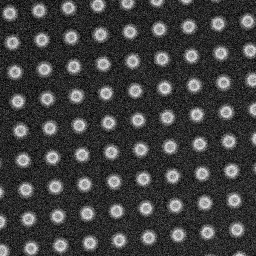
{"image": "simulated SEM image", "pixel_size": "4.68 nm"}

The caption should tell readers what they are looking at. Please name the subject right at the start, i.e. an array of small figures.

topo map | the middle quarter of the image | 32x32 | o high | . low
oooo....oooo...oooo.....o.......
.ooo.....oo.....................
.oo.............................
................................
........................oo.....o
..........o.....ooo....oooo....o
..oo.....ooo....oooo...oooo....o
.oooo....ooo....oooo....ooo.....
.oooo....ooo.....oo.............
..oo............................
................................
.........................oo.....
.................ooo....oooo...o
...oo.....ooo....ooo....oooo...o
..oooo...oooo....ooo....ooo.....
..oooo...oooo....ooo............
..oooo....oo....................
................................
................................
..................oo.....ooo....
...........oo....oooo....oooo...
...ooo....oooo...oooo....ooo....
...ooo....oooo...oooo.....oo....
...ooo....ooo...................
....oo..........................
................................
..........................oo....
............o.....ooo....oooo...
....oo.....ooo....oooo...oooo...
...oooo....oooo...oooo....ooo...
...oooo....ooo.....oo...........
....ooo.........................